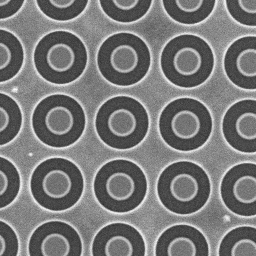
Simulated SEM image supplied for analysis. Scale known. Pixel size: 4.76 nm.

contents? an array of small figures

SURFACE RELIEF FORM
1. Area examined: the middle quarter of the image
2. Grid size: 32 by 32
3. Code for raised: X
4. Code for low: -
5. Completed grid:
XX----XX----XXXXX-----XX----XXXX
-----XXXX-----XXX----XXX----XXXX
----XXXXX------------XXXX-------
---XXXXXXX----------XXXXXX------
--XXXXXXXXX--------XXXXXXXX-----
XXXXXXXXXXXXXX--XXXXXXXXXXXXX---
XXXXXXXXXXXXXXXXXXXXXXXXXXXXXXXX
XXXXXXXXXXXXXXXXXXXXXXXXXXXXXXXX
--XXXXXXXXXX-----XXXXXXXXXXXX---
---XXXXXXX---------XXXXXXX------
----XXXXX-----------XXXXXX------
X----XXXX------------XXXX-------
X----XXX----XXXXX----XXX----XXXX
XX---XXX----XXXXX----XXX----XXXX
XX---XXX---XXXXXXX---XXX---XXXXX
XX---XXX---XXXXXXX---XXX---XXXXX
X----XXX----XXXXX----XXX----XXXX
-----XXX-----XXX-----XXX----XXXX
----XXXXX-----------XXXXX-------
---XXXXXXX---------XXXXXX-------
-XXXXXXXXXX-------XXXXXXXX------
XXXXXXXXXXXXXXXXXXXXXXXXXXXX----
XXXXXXXXXXXXXXXXXXXXXXXXXXXXXXXX
XXXXXXXXXXXXXXXXXXXXXXXXXXXXXXXX
--XXXXXXXXX------XXXXXXXXXXX----
---XXXXXXX---------XXXXXXX------
----XXXXX----------XXXXXX-------
----XXXX------------XXXX--------
X----XXX----XXXX-----XXX----XXXX
X----XX----XXXXXX----XX----XXXXX
X----XX----XXXXXX----XX----XXXXX
X----XX----XXXXXX----XX----XXXXX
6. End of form